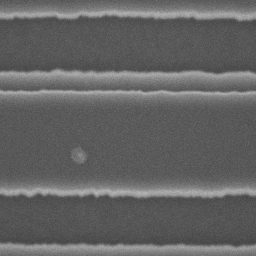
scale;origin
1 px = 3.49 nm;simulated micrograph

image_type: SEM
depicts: lines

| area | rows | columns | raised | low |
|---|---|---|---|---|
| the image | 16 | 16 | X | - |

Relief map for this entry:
XXXXXXXXXXXXXXXX
----------------
----------------
----------------
----------------
----------------
XXXXXXXXXXXXXXXX
XXXXXXXXXXXXXXXX
XXXXXXXXXXXXXXXX
XXXXXXXXXXXXXXXX
XXXXXXXXXXXXXXXX
XXXXXXXXXXXXXXXX
----------------
----------------
----------------
----------------